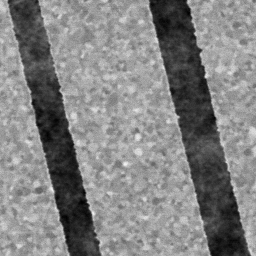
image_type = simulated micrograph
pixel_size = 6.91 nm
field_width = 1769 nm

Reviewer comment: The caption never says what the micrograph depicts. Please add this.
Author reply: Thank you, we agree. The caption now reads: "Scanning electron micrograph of one or a few lines or trenches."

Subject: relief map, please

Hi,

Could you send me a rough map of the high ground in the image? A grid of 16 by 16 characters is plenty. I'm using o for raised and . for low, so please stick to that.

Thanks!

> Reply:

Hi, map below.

o..oooooo...oooo
o..ooooooo..oooo
o..ooooooo..oooo
o..ooooooo...ooo
o...oooooo...ooo
oo..ooooooo..ooo
oo..ooooooo..ooo
oo..ooooooo...oo
oo..ooooooo...oo
ooo..ooooooo..oo
ooo..ooooooo..oo
ooo..ooooooo...o
ooo..ooooooo...o
oooo..ooooooo..o
oooo..ooooooo..o
oooo..ooooooo...